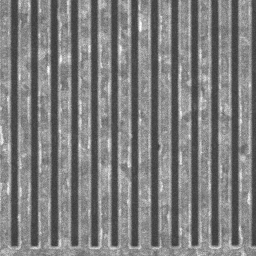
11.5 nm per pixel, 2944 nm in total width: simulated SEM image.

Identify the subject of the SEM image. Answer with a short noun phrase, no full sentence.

parallel lines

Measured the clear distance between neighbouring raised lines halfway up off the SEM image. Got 104 nm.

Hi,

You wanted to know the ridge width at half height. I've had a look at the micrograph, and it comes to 0.124 microns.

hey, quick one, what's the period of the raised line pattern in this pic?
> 20.1 px